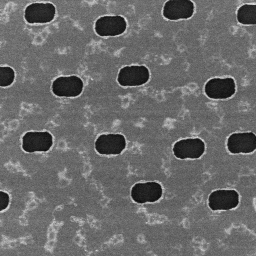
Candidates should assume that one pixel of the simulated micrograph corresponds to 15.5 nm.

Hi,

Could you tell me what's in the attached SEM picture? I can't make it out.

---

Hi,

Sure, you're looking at a regular array of holes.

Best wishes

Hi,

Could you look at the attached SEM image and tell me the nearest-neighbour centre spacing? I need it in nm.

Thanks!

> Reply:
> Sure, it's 954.